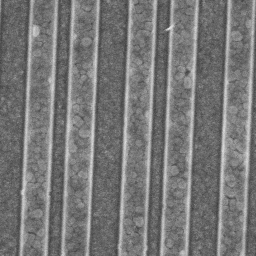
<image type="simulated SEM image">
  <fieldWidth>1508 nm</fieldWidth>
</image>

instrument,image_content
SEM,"parallel lines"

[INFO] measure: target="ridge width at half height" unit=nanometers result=152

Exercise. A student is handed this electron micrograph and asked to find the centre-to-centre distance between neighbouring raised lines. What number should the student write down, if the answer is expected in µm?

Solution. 0.291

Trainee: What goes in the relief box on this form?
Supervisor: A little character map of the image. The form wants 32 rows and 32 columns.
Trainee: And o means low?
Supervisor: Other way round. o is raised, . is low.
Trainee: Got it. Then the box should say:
....ooo..ooo....ooo...ooo....ooo
....ooo..ooo....ooo..oooo....ooo
....ooo..ooo....ooo..oooo...oooo
....ooo..ooo....ooo..oooo...oooo
....ooo..ooo....ooo..ooo....oooo
....ooo..ooo....ooo..ooo....oooo
....ooo..ooo....ooo..ooo....oooo
....ooo..ooo....ooo..ooo....oooo
....ooo..ooo....ooo..ooo....ooo.
....ooo..ooo....ooo..ooo....ooo.
....ooo..ooo....ooo..ooo....ooo.
...oooo..ooo....ooo..ooo....ooo.
...oooo..ooo....ooo..ooo....ooo.
...oooo..ooo....ooo..ooo....ooo.
...ooo..oooo....ooo..ooo....ooo.
...ooo..oooo....ooo..ooo....ooo.
...ooo..oooo....ooo..ooo....ooo.
...ooo..oooo....ooo..ooo....ooo.
...ooo..oooo...oooo..ooo....ooo.
...ooo..oooo...oooo..ooo....ooo.
...ooo..ooo....oooo..ooo....ooo.
...ooo..ooo....oooo..ooo....ooo.
...ooo..ooo....ooo...ooo....ooo.
...ooo..ooo....ooo...ooo....ooo.
...ooo..ooo....ooo..oooo....ooo.
...ooo..ooo....ooo..oooo....ooo.
...ooo..ooo....ooo..oooo...oooo.
...ooo..ooo....ooo..oooo....ooo.
...ooo..ooo....ooo..ooo....oooo.
...ooo..ooo....ooo..ooo....oooo.
...ooo..ooo....ooo..ooo....oooo.
...ooo..ooo....ooo..ooo....oooo.